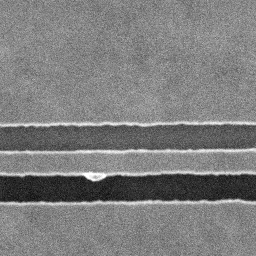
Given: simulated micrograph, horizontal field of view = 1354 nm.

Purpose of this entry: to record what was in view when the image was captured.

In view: lines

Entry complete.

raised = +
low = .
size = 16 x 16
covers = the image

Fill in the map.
++++++++++++++++
++++++++++++++++
++++++++++++++++
++++++++++++++++
++++++++++++++++
++++++++++++++++
++++++++++++++++
++++++++++++++++
++++++++++++++++
++++++++++++++++
++++++++++++++++
................
................
++++++++++++++++
++++++++++++++++
++++++++++++++++